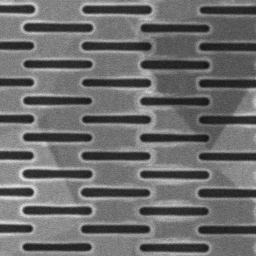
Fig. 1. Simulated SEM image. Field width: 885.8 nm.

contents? groups of lines, slits or small figures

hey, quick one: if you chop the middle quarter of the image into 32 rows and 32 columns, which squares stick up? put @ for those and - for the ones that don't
-------@@@@@@@@@@@@-------------
---@@@@@@@@@@@@@@@@@------------
@@@@@@@@@@@@@@@@@@@@@@@@@@@@@@@@
@@@@@----------------@@@@@@@@@@@
@@@@------------------@@@@@@@@@@
@@@@@-----------------@@@@@@@@@@
@@@@@@@@@@@@@@@@@@@@@@@@@@@@@@@@
@@@@@@@@@@@@@@@@@@@@@@@@@@@@@@@@
-------@@@@@@@@@@@@-------------
-------@@@@@@@@@@@@-------------
@@@@@@@@@@@@@@@@@@@@------------
@@@@@@@@@@@@@@@@@@@@@@@@@@@@@@@@
@@@@@@@@@@@@--------@@@@@@@@@@@@
@@@@------------------@@@@@@@@@@
@@@@@-----------------@@@@@@@@@@
@@@@@@@@@@@@@@@@@@@@@@@@@@@@@@@@
@@@@@@@@@@@@@@@@@@@@@@@@@@@@@@@@
-------@@@@@@@@@@@@-------------
-------@@@@@@@@@@@@-------------
------@@@@@@@@@@@@@-------------
@@@@@@@@@@@@@@@@@@@@@@@@@@@@@@@@
@@@@@@@@@@@@@@@@@@@@@@@@@@@@@@@@
@@@@------------------@@@@@@@@@@
@@@@------------------@@@@@@@@@@
@@@@@@@@@@@@@@@@@---@@@@@@@@@@@@
@@@@@@@@@@@@@@@@@@@@@@@@@@@@@@@@
-------@@@@@@@@@@@@-------------
-------@@@@@@@@@@@@-------------
-------@@@@@@@@@@@@-------------
@@@@@@@@@@@@@@@@@@@@@@@@@@@@@@@@
@@@@@@---@@@@@@@@@@@@@@@@@@@@@@@
@@@@------------------@@@@@@@@@@